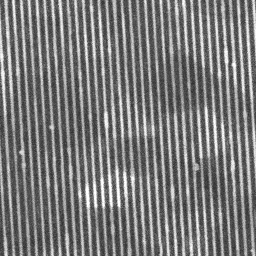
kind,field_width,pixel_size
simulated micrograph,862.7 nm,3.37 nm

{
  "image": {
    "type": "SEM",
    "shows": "parallel lines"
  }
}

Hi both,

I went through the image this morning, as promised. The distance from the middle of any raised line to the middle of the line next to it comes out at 26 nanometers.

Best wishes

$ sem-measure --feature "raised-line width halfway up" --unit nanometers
6.7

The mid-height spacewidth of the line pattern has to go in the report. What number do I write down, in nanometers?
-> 17.7